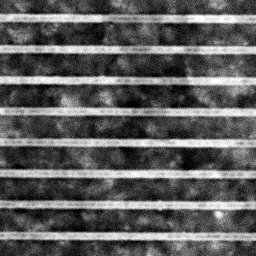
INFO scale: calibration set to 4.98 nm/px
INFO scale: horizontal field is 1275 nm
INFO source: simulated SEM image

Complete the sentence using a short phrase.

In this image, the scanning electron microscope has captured parallel lines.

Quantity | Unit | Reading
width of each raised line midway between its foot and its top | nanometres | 30.5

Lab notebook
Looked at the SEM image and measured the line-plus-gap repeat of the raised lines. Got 0.155 microns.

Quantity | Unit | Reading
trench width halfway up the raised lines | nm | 124